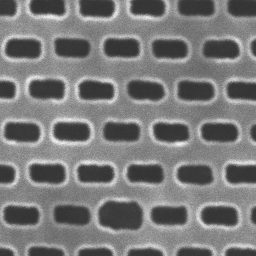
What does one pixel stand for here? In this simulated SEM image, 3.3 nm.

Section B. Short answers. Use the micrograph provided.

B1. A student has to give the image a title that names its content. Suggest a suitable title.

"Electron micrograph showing a regular array of holes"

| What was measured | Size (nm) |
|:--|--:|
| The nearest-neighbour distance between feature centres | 158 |